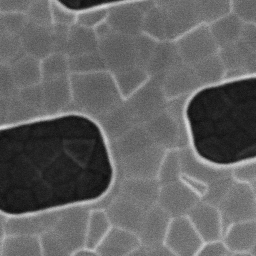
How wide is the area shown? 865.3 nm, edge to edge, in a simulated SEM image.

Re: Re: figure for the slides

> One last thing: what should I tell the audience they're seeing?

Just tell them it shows holes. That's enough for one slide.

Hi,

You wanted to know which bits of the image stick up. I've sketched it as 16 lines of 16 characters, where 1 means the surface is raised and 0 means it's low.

1111001111111111
1111111111111111
1111111111111111
1111111111111111
1111111111111111
1111111111111000
1111111111110000
1110001111110000
0000001111110000
0000000111110000
0000000111111111
0000000111111111
0000001111111111
1111111111111111
1111111111111111
1111111111111111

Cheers